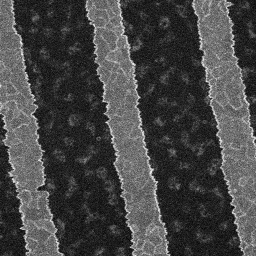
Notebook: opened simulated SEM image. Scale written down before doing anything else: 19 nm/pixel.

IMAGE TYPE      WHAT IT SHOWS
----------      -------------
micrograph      one or a few lines or trenches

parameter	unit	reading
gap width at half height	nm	1380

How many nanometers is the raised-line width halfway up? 615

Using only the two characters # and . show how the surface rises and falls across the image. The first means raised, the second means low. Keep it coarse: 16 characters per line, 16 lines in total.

#....##.....##..
#.....##....##..
#.....##.....##.
#.....##.....##.
##....##.....##.
##....###....##.
##.....##....##.
##.....##.....##
##.....##.....##
.##....##.....##
.##....##.....##
.##.....##....##
.##.....##.....#
.##.....##.....#
..#.....##.....#
..##....##.....#